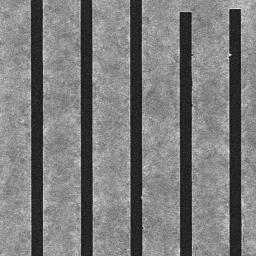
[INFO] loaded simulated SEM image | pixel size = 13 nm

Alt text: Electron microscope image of parallel lines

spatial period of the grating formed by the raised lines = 642 nanometres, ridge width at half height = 480 nanometres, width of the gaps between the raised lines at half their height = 160 nanometres